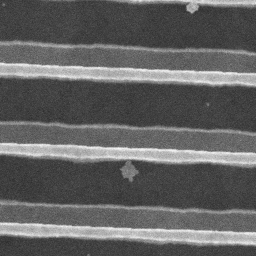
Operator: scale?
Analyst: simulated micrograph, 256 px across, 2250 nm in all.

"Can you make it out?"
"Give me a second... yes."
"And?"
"lines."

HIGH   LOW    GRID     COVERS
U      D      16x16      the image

DDDDDDDDDDDDDDDD
DDDDDDDDDDDDDDDD
DDDDDDDDDDDDDDDD
UUUUUUUUUUUUUUUU
UUUUUUUUUUUUUUUU
DDDDDDDDDDDDDDDD
DDDDDDDDDDDDDDDD
DDDDDDDDDDDDDDDD
UUUUUUUUUUUUUUUU
UUUUUUUUUUUUUUUU
DDDDDDDDDDDDDDDD
DDDDDDDDDDDDDDDD
DDDDDDDDDDDDDDDD
UUUUUUUUUUUUUUUU
UUUUUUUUUUUUUUUU
DDDDDDDDDDDDDDDD